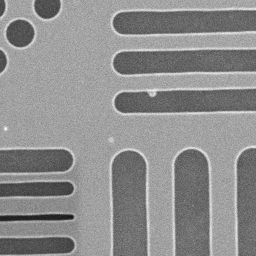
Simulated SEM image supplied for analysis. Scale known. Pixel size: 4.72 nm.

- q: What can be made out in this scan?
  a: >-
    groups of lines, slits or small figures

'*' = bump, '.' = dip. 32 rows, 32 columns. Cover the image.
.***....************************
.***...********.................
**.***********..................
*...**********..................
*...****************************
*...****************************
***************.................
.*************..................
.*************..................
********************************
********************************
****************................
**************..................
**************..................
********************************
********************************
********************************
********************************
********************************
.........*****....****....****..
.........*****....****....****..
........******....****....***...
**************....****....***...
.........*****....****....***...
........******....****....***...
**************....****....***...
**************....****....****..
.........*****....****....****..
**************....****....****..
**************....****....****..
.........*****....****....****..
.........*****....****....****..